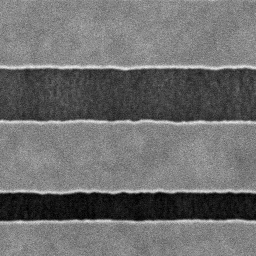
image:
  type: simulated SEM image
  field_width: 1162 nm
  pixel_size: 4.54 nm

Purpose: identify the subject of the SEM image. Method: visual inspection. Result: lines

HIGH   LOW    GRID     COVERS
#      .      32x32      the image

################################
################################
################################
################################
################################
################################
################################
################################
.#.....#......###.........##...#
................................
................................
................................
................................
................................
................................
################################
################################
################################
################################
################################
################################
################################
################################
################################
................................
................................
................................
.............................#..
################################
################################
################################
################################